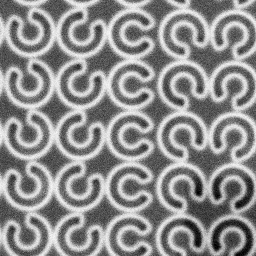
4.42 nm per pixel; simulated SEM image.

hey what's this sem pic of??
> an array of small figures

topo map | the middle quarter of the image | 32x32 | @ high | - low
@----@@@@@@@@@------@@@@@@@-----
-----@@@@@@@@--------@@@@@------
---@@@@@@@@@----@@----@@@-------
--@@@@@---@@---@@@@--@@@@---@@@@
-@@@@@@---@---@@@@@@@@@@---@@@@@
-@@@@@@---@---@@@@@@@@@@---@@@@@
--@@@@@---@@--@@@@@@@@@@---@@@@@
---@@@---@@@---@@@@---@@@---@@@@
---------@@@----------@@@-----@@
@-------@@@@@--------@@@@@-----@
@@@--@@@@@@@@@@@---@@@@@@@@@--@@
@@@@@@@@@@@@@@@@@@@@@@@@@@@@@@@@
@@--@@@@@@@@@@@@--@@@@@@@@@@@@@@
@----@@@@@@@@-------@@@@@@------
----@@@@@@@@@--------@@@@-------
--@@@@@@-@@@----@@----@@@----@@-
-@@@@@@---@---@@@@@@@@@@---@@@@@
-@@@@@@---@---@@@@@@@@@@---@@@@@
-@@@@@@---@---@@@@@@@@@@---@@@@@
--@@@@---@@---@@@@@-@@@@---@@@@@
---@@----@@@---@@@----@@@---@@@@
--------@@@@---------@@@@-----@@
@------@@@@@@@------@@@@@@----@@
@@@@@@@@@@@@@@@@--@@@@@@@@@@--@@
@@@@@@@@@@@@@@@@@@@@@@@@@@@@@@@@
@---@@@@@@@@@@@----@@@@@@@@@---@
-----@@@@@@@@-------@@@@@@------
----@@@@@@@@---------@@@@-------
--@@@@@--@@@---@@@@--@@@@---@@@-
-@@@@@---@@---@@@@@@@@@@---@@@@@
-@@@@@@---@---@@@@@@@@@@---@@@@@
-@@@@@@--@@---@@@@@@@@@@---@@@@@